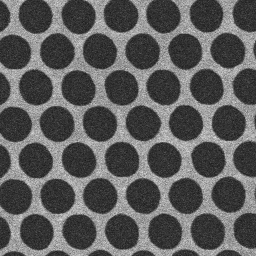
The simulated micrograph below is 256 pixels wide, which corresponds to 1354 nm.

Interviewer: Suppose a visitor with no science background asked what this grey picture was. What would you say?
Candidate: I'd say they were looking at a regular array of holes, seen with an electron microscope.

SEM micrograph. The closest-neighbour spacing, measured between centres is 220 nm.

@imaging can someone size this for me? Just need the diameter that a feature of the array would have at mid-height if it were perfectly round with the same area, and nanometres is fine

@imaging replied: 184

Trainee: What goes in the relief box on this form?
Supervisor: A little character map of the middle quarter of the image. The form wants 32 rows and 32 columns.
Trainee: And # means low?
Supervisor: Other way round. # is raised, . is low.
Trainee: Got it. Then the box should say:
.######.....#####.....######....
###.#########.##########..####.#
#.....#####......#####......####
.......####.......###.......####
.......###........###........###
........##........###........##.
........##.........##........###
........###.......###........###
.......####.......####.......###
#......#####.....######.....####
##############.###..#########..#
.#####.....######.....######....
..###.......####.......####.....
..###........###........##......
..###........##.........##......
...##........###........##......
...##........###........###.....
..####.......###.......####.....
.######.....#####.....######....
###.####################.#######
#.....######.....#####.....#####
.......####.......###.......####
.......###.........##........###
........##.........##........###
........##.........##.........##
........###........##........###
.......####.......####.......###
#......#####......#####.....####
#########################.####.#
######......#####.....######....
..###.......####.......####.....
..###........###........##......